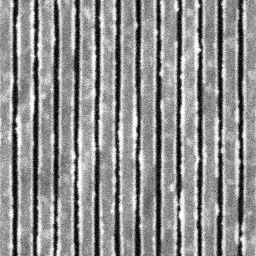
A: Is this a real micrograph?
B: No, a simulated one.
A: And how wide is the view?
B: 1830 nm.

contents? parallel lines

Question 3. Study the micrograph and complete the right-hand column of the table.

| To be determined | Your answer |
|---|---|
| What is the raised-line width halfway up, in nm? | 109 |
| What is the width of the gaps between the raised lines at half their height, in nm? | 38.4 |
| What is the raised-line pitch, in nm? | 146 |